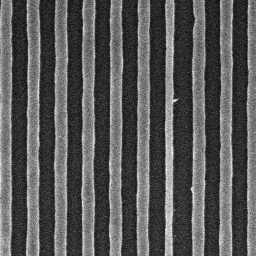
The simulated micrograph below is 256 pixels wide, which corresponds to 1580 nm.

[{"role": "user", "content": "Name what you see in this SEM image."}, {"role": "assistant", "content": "parallel lines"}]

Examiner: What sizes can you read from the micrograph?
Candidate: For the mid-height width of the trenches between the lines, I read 0.098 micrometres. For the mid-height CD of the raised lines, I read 0.071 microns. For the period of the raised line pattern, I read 170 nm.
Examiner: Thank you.